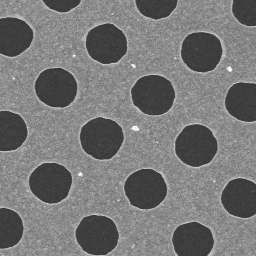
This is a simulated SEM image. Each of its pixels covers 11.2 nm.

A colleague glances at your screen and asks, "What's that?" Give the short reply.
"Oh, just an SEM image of a regular array of holes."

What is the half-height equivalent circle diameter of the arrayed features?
465 nm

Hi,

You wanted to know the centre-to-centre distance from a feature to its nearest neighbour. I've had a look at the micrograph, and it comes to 743 nanometers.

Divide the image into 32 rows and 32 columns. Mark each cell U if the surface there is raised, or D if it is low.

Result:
UUUUUUDDDDUUUUUUUDDDDDUUUUUUUDDD
UUUUUUUUUUUUUUUUUUDDDDUUUUUUUDDD
DDDUUUUUUUUUUUUUUUUUUUUUUUUUUUDD
DDDDUUUUUUUUDDDUUUUUUUUUUUUUUUUU
DDDDUUUUUUUDDDDDUUUUUUUDDDDUUUUU
DDDDUUUUUUUDDDDDUUUUUUUDDDDDUUUU
DDDUUUUUUUUDDDDDUUUUUUUDDDDDUUUU
UUUUUUUUUUUUDDDUUUUUUUUDDDDDUUUU
UUUUUUUUUUUUUUUUUUUUUUUUDDDUUUUU
UUUUUDDDDUUUUUUUUUDDUUUUUUUUUUUU
UUUUDDDDDDUUUUUUUDDDDUUUUUUUUDDD
UUUUDDDDDDUUUUUUDDDDDDUUUUUUDDDD
UUUUUDDDDUUUUUUUDDDDDDUUUUUUDDDD
UUUUUUUUUUUUUUUUUDDDDUUUUUUUDDDD
DDUUUUUUUUUUUUUUUUUUUUUUUUUUUDDD
DDDUUUUUUUUDDDDUUUUUUUUUUUUUUUUU
DDDUUUUUUUDDDDDUUUUUUUUDDDUUUUUU
DDDUUUUUUUDDDDDUUUUUUUDDDDDUUUUU
DDUUUUUUUUDDDDDUUUUUUUDDDDDUUUUU
UUUUUUUUUUUDDDUUUUUUUUDDDDDUUUUU
UUUUUDDUUUUUUUUUUUUUUUUDDDUUUUUU
UUUUDDDDDUUUUUUUUDDDUUUUUUUUUUUU
UUUUDDDDDUUUUUUUDDDDUUUUUUUUUDDU
UUUUDDDDDUUUUUUUDDDDDUUUUUUUDDDD
UUUUDDDDUUUUUUUUDDDDDUUUUUUUDDDD
UUUUUUUUUUUUUUUUDDDDUUUUUUUUDDDD
DDUUUUUUUUUUUUUUUUUUUUUUUUUUUDDD
DDDUUUUUUUDDDDUUUUUUUUUUUUUUUUUU
DDDUUUUUUUDDDDDUUUUUUUDDDDUUUUUU
DDDUUUUUUDDDDDDUUUUUUUDDDDDUUUUU
DDUUUUUUUUDDDDDUUUUUUUDDDDDUUUUU
UUUUUUUUUUUDDDUUUUUUUUDDDDUUUUUU